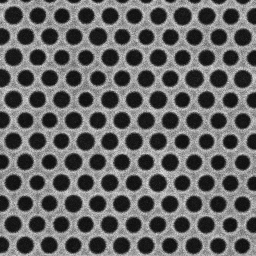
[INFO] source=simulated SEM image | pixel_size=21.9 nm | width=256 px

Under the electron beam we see a regular array of holes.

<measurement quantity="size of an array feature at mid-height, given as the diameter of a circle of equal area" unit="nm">383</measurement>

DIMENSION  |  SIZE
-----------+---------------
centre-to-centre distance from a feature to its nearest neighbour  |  518 nm